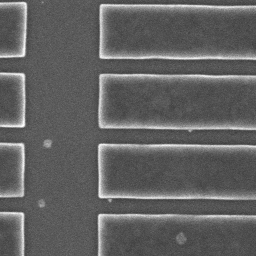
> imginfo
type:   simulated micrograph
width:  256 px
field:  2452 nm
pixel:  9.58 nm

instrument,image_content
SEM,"wiring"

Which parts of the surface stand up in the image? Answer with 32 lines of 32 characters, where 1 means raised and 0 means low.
11100000000000000000000000000000
11100000000001111111111111111111
11100000000001111111111111111111
11100000000001111111111111111111
11100000000001111111111111111111
11100000000001111111111111111111
11100000000001111111111111111111
00000000000000000000000000000000
00000000000000000000000000000000
11100000000001111111101111000000
11100000000001111111111111111111
11100000000001111111111111111111
11100000000001111111111111111111
11100000000011111111111111111111
11100000000011111111111111111111
11100000000001111111111111111111
00000000000000000000000000000000
00000000000000000000000000000000
11100000000011111111111111111111
11100000000011111111111111111111
11100000000011111111111111111111
11100000000011111111111111111111
11100000000011111111111111111111
11100000000011111111111111111111
11000000000001111111111111111111
00000000000000000000000000000000
00000000000000000000000000000000
11100000000011111111111111111111
11100000000011111111111111111111
11100000000011111111111111111111
11100000000011111111111111111111
11100000000011111111111111111111